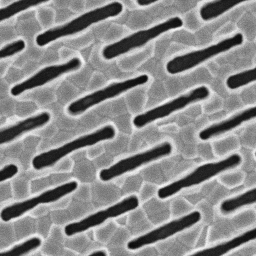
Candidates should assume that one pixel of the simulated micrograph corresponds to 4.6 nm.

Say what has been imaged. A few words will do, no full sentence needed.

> a regular array of holes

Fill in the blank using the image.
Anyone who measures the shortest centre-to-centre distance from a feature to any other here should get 0.283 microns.